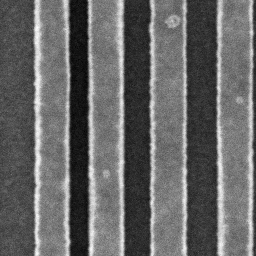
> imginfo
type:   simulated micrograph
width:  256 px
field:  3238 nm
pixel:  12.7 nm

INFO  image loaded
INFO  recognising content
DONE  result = lines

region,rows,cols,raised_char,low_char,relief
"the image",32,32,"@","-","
----@@@@@--@@@@----@@@@----@@@@@
----@@@@@--@@@@----@@@@----@@@@@
----@@@@@--@@@@----@@@@----@@@@@
----@@@@@--@@@@----@@@@----@@@@@
----@@@@@--@@@@----@@@@----@@@@@
----@@@@@--@@@@----@@@@----@@@@@
----@@@@@--@@@@----@@@@----@@@@@
----@@@@@--@@@@----@@@@----@@@@@
----@@@@@--@@@@----@@@@----@@@@@
----@@@@@--@@@@----@@@@----@@@@@
----@@@@@--@@@@----@@@@----@@@@@
-----@@@@--@@@@----@@@@----@@@@@
----@@@@@--@@@@----@@@@----@@@@@
----@@@@@--@@@@----@@@@----@@@@@
----@@@@@--@@@@----@@@@----@@@@@
----@@@@@--@@@@----@@@@----@@@@@
----@@@@@--@@@@----@@@@----@@@@@
----@@@@@--@@@@----@@@@----@@@@@
----@@@@@--@@@@----@@@@----@@@@@
----@@@@@--@@@@----@@@@----@@@@@
----@@@@@--@@@@----@@@@----@@@@@
----@@@@@--@@@@----@@@@----@@@@@
----@@@@@--@@@@----@@@@----@@@@@
----@@@@@--@@@@----@@@@----@@@@@
----@@@@@--@@@@----@@@@----@@@@@
----@@@@@--@@@@----@@@@----@@@@@
----@@@@@--@@@@----@@@@----@@@@@
----@@@@@--@@@@----@@@@----@@@@@
----@@@@@--@@@@----@@@@----@@@@@
----@@@@@--@@@@----@@@@----@@@@@
-----@@@@--@@@@----@@@@----@@@@@
----@@@@@--@@@@----@@@@----@@@@@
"